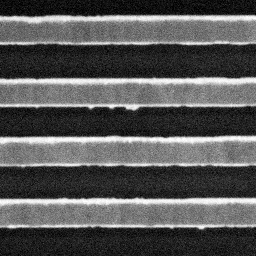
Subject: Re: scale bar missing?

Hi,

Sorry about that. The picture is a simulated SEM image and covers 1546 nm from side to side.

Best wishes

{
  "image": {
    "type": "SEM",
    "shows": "lines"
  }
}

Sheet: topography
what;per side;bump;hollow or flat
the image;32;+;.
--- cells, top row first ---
................................
................................
++++++++++++++++++++++++++++++++
++++++++++++++++++++++++++++++++
++++++++++++++++++++++++++++++++
................................
................................
................................
................................
................................
++++++++++++++++++++++++++++++++
++++++++++++++++++++++++++++++++
++++++++++++++++++++++++++++++++
................................
................................
................................
................................
++++++++++++++++++++++++++++++++
++++++++++++++++++++++++++++++++
++++++++++++++++++++++++++++++++
++++++++++++++++++++++++++++++++
................................
................................
................................
................................
++++++++++++++++++++++++++++++++
++++++++++++++++++++++++++++++++
++++++++++++++++++++++++++++++++
................................
................................
................................
................................